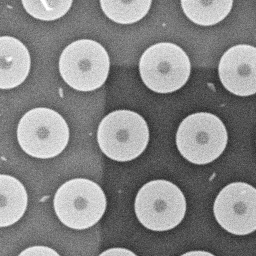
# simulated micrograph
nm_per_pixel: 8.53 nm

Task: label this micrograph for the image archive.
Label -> an array of small figures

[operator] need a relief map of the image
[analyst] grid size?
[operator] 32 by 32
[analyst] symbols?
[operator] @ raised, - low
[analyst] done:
---@@@@@@----@@@@@@----@@@@@@---
----@@@@-----@@@@@-----@@@@@@---
--------------@@@-------@@@@----
--------------------------------
--------------------------------
@@@------@@@--------@@----------
@@@-----@@@@@-----@@@@@-----@@@@
@@@@----@@@@@@----@@@@@@----@@@@
@@@@---@@@@@@@----@@@@@@---@@@@@
@@@-----@@@@@-----@@@@@@---@@@@@
@@-------@@@@-----@@@@@-----@@@@
--------------------@--------@@@
--------------------------------
--------------------------------
---@@@@@-----@@@@@------@@@-----
--@@@@@@-----@@@@@-----@@@@@----
--@@@@@@@---@@@@@@----@@@@@@----
--@@@@@@----@@@@@@----@@@@@@----
---@@@@@-----@@@@@----@@@@@@----
----@@@-------@@@------@@@@-----
--------------------------------
--------------------------------
@@-------@@---------------------
@@@-----@@@@------@@@@------@@@@
@@@----@@@@@@----@@@@@@----@@@@@
@@@----@@@@@@----@@@@@@----@@@@@
@@@----@@@@@@----@@@@@@----@@@@@
@@------@@@@-----@@@@@@----@@@@@
---------@@--------@@-------@@@@
--------------------------------
--------------------------------
---@@@@------@@@--------@-------